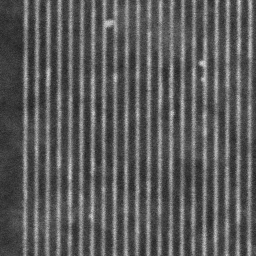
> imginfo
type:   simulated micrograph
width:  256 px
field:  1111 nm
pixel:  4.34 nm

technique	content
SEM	parallel lines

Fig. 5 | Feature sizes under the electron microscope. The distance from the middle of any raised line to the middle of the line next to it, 48.7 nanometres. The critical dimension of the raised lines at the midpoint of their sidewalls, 0.0109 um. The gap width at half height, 0.038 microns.